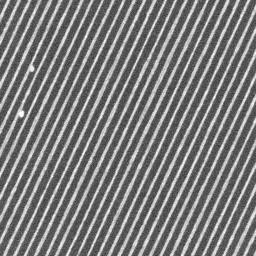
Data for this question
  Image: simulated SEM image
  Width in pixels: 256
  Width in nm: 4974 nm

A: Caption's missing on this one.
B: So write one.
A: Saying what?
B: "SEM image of parallel lines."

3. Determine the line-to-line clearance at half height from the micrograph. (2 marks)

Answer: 7.7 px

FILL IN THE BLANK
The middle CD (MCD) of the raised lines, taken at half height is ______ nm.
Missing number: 37.5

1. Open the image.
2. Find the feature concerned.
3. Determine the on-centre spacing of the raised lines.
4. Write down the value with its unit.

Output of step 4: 184 nanometres